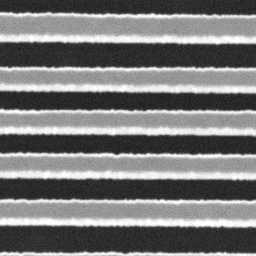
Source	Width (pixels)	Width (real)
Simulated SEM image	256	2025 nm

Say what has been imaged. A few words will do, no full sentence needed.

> lines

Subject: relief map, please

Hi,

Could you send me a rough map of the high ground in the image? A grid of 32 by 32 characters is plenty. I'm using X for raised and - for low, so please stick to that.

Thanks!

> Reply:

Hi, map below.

--------------------------------
--------------------------------
XXXXXXXXXXXXXXXXXXXXXXXXXXXXXXXX
XXXXXXXXXXXXXXXXXXXXXXXXXXXXXXXX
XXXXXXXXXXXXXXXXXXXXXXXXXXXXXXXX
--------------------------------
--------------------------------
--------------------------------
X-XXXX--X-------------X---X-----
XXXXXXXXXXXXXXXXXXXXXXXXXXXXXXXX
XXXXXXXXXXXXXXXXXXXXXXXXXXXXXXXX
--------------------------------
--------------------------------
--------------------------------
XXXXXXXXXXXXXXXXXXXXXXXXXXXXXXXX
XXXXXXXXXXXXXXXXXXXXXXXXXXXXXXXX
XXXXXXXXXXXXXXXXXXXXXXXXXXXXXXXX
--------------------------------
--------------------------------
XXXXXXXXXXXXXXXXXXXXXXXXXXXXXXXX
XXXXXXXXXXXXXXXXXXXXXXXXXXXXXXXX
XXXXXXXXXXXXXXXXXXXXXXXXXXXXXXXX
--------------------------------
--------------------------------
--------------------------------
XXXXXXXXXXXXXXXXXXXXXXXXXXXXXXXX
XXXXXXXXXXXXXXXXXXXXXXXXXXXXXXXX
XXXXXXXXXXXXXXXXXXXXXXXXXXXXXXXX
--------------------------------
--------------------------------
--------------------------------
--------------------------------